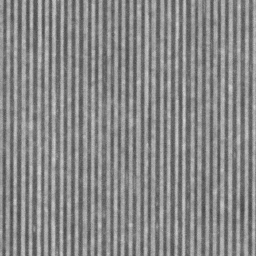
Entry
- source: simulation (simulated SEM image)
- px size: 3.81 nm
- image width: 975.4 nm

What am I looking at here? parallel lines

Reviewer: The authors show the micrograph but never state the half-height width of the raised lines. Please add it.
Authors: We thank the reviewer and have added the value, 0.0119 micrometres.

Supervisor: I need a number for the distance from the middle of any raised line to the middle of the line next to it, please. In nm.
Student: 29.3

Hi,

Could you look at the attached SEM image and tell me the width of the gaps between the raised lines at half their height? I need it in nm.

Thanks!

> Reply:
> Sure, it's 18.1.